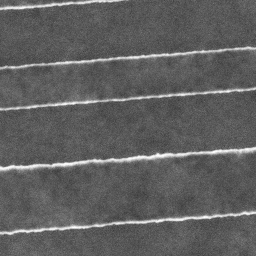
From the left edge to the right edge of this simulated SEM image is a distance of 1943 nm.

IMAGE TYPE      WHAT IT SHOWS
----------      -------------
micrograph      lines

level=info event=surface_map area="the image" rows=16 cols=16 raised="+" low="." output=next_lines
++..............
................
................
.........+++++++
++++++++++++++++
++++++++++++++++
++++............
................
................
.............+++
++++++++++++++++
++++++++++++++++
++++++++++++++++
++++++++++++++..
++..............
................